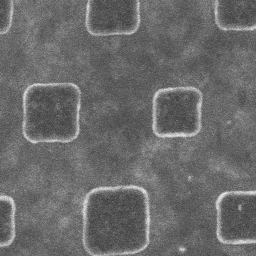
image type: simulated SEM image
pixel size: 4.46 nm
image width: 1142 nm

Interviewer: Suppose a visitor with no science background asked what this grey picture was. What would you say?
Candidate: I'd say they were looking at raised bodies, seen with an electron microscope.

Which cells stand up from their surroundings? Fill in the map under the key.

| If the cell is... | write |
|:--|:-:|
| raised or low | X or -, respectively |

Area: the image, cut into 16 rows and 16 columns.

X----XXXX----XXX
X----XXXX-----XX
----------------
----------------
----------------
--XXX------X----
--XXX-----XXX---
-XXXX-----XXX---
--XXX-----XX----
----------------
----------------
----------------
X----XXXX-----XX
X----XXXX-----XX
X----XXXX-----XX
-----XXXX-------